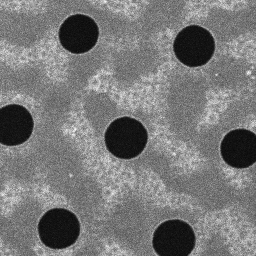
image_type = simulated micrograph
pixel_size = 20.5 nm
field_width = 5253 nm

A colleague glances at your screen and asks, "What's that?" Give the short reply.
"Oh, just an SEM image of holes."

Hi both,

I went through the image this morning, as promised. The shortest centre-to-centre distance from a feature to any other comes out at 114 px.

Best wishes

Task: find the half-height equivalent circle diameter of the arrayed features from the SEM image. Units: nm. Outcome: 862